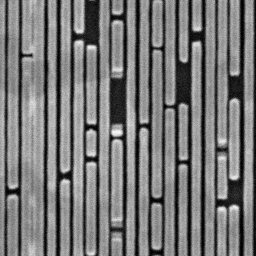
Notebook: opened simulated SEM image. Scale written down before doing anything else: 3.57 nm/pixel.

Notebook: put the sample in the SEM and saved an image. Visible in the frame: parallel lines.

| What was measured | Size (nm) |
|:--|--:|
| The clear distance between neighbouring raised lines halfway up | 16.9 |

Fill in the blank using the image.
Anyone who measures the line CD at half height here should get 8.63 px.